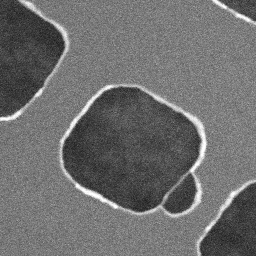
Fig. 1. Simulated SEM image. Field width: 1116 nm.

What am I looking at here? holes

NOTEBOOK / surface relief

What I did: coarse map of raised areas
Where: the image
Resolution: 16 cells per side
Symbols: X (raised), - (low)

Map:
--XXXXXXXXXXXX--
---XXXXXXXXXXXXX
----XXXXXXXXXXXX
----XXXXXXXXXXXX
---XXXXXXXXXXXXX
---XXXX--XXXXXXX
--XXXX----XXXXXX
XXXXX-------XXXX
XXXX---------XXX
XXXX---------XXX
XXXX--------XXXX
XXXXX-------XXXX
XXXXXXX-----XX--
XXXXXXXXXXXXXX--
XXXXXXXXXXXXX---
XXXXXXXXXXXX----